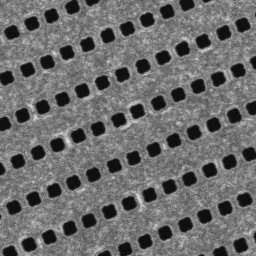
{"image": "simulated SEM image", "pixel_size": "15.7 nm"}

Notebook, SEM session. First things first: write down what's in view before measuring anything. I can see a regular array of holes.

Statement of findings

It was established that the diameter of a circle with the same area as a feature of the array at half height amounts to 0.222 microns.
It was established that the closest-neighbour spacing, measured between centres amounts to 335 nm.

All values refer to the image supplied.